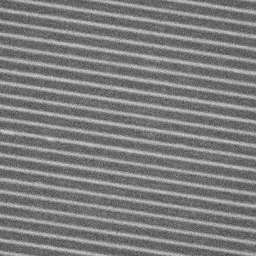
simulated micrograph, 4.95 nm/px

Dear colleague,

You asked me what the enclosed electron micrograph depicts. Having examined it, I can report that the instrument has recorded parallel lines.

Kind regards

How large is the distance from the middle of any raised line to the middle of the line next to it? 59.4 nm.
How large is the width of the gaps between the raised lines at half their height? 45.3 nanometres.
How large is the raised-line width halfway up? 13.4 nm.